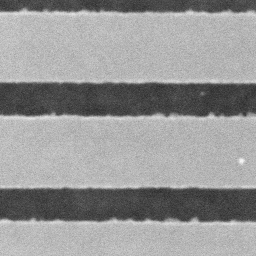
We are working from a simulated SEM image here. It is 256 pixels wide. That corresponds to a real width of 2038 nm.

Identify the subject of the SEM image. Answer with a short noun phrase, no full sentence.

lines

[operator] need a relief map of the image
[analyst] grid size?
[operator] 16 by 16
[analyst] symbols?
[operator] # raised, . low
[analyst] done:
................
################
################
################
################
................
................
################
################
################
################
################
................
................
################
################